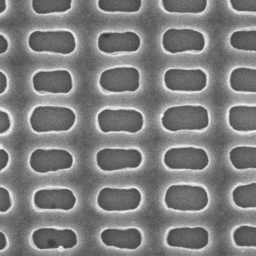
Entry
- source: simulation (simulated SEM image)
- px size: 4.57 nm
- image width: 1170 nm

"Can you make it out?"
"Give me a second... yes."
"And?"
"a regular array of holes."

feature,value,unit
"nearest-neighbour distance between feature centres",38.8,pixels